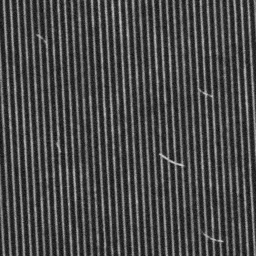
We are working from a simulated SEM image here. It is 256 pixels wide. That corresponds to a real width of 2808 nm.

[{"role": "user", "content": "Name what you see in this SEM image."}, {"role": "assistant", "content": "parallel lines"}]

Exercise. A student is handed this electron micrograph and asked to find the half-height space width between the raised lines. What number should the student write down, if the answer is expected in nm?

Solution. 56.1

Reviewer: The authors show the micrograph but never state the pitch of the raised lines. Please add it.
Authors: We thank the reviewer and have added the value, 74.4 nm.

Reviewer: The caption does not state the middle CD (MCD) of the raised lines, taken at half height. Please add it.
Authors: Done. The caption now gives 1.38 pixels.